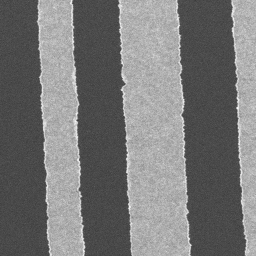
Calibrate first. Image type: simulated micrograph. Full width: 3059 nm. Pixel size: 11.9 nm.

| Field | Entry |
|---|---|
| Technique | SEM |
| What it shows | one or a few lines or trenches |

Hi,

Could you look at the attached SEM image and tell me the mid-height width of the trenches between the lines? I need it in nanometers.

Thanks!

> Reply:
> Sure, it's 627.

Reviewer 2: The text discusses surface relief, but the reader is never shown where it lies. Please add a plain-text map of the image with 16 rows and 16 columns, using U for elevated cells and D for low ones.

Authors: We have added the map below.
DDUUUDDDUUUDDDDU
DDUUUDDDUUUDDDDU
DDUUUDDDUUUDDDDU
DDDUUDDDUUUDDDDU
DDDUDDDDUUUDDDDU
DDDUDDDDUUUDDDDU
DDDUUDDDUUUDDDDU
DDDUUDDDUUUDDDDU
DDDUUDDDUUUDDDDU
DDDUUDDDUUUUDDDU
DDDUUDDDUUUUDDDU
DDDUUDDDUUUUDDDU
DDDUUDDDUUUUDDDU
DDDUUDDDUUUUDDDU
DDDUUDDDUUUUDDDU
DDDUUDDDUUUUDDDU